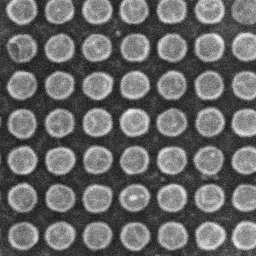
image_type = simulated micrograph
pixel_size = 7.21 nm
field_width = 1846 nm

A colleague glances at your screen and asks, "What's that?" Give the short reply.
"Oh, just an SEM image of a regular array of raised bodies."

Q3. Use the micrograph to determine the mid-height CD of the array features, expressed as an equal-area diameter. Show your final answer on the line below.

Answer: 0.195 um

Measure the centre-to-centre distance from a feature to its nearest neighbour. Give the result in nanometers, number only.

267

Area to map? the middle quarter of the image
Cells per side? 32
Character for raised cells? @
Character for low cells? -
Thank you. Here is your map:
--------------------------------
--------------------------------
--------@-------@@@@------@@@---
@@----@@@@@@---@@@@@@----@@@@@--
@@---@@@@@@@---@@@@@@---@@@@@@--
@@---@@@@@@@--@@@@@@@---@@@@@@--
@@---@@@@@@@---@@@@@@---@@@@@@--
@----@@@@@@----@@@@@-----@@@@@--
--------@@---------------@@@----
--------------------------------
--------------------------------
-----------------@---------@----
@-----@@@@@----@@@@@-----@@@@@--
@@---@@@@@@@---@@@@@@---@@@@@@--
@@---@@@@@@@--@@@@@@@---@@@@@@--
@@---@@@@@@@--@@@@@@@---@@@@@@--
@@---@@@@@@----@@@@@----@@@@@@--
@-----@@@@------@@@------@@@@---
--------------------------------
--------------------------------
--------------------------------
@-----@@@@------@@@@-----@@@@---
@@----@@@@@@---@@@@@@---@@@@@@--
@@@--@@@@@@@--@@@@@@@---@@@@@@--
@@---@@@@@@@--@@@@@@@---@@@@@@--
@@---@@@@@@---@@@@@@@---@@@@@@--
@-----@@@@@----@@@@@-----@@@@---
--------------------------------
--------------------------------
--------------------------------
-------@@---------@-------@@@---
@-----@@@@@----@@@@@@---@@@@@@--